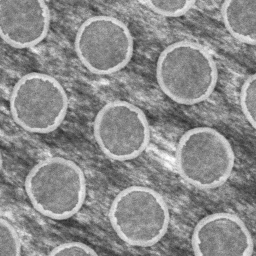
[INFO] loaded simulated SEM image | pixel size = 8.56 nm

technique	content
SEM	raised bodies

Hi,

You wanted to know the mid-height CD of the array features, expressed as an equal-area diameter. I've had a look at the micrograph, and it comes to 470 nm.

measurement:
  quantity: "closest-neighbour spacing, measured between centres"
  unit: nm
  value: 744